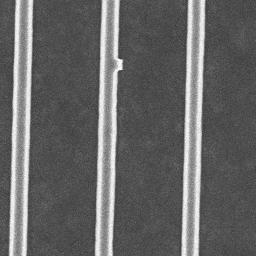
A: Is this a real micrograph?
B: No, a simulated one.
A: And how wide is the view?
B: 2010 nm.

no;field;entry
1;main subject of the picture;one or a few lines or trenches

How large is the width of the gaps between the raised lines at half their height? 0.567 um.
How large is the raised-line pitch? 86 pixels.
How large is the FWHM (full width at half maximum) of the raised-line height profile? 106 nm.